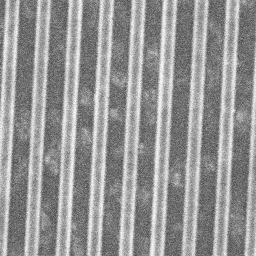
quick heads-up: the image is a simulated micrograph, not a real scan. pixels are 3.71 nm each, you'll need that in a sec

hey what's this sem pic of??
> parallel lines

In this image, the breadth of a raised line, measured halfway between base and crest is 11.5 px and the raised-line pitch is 0.117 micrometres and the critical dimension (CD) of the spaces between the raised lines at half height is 74.2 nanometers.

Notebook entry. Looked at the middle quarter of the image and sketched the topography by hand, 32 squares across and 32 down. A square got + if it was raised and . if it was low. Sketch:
.++......++.....+++.....+++.....
.++......++.....+++.....+++.....
.++.....+++.....+++.....+++.....
.++.....+++.....+++.....+++.....
+++.....+++.....+++.....+++.....
+++.....+++.....+++.....+++.....
+++.....+++.....+++.....+++.....
+++.....+++.....+++.....+++.....
+++.....+++.....+++.....+++.....
+++.....+++.....+++.....++......
+++.....+++.....+++.....++......
+++.....+++.....+++.....++......
+++.....+++.....+++.....++......
+++.....+++.....+++.....++.....+
+++.....++......+++.....++.....+
+++.....++......++......++.....+
+++.....++......++.....+++.....+
++......++......++.....+++.....+
++......++......++.....+++.....+
++......++......++.....+++.....+
++......++......++.....+++.....+
++.....+++......++.....+++.....+
++.....+++......++.....+++.....+
++.....+++.....+++.....+++.....+
++.....+++.....+++.....+++.....+
++.....+++.....+++.....+++.....+
++.....+++.....+++.....+++.....+
++.....+++.....+++.....+++.....+
++.....+++.....+++.....++......+
++.....+++.....+++.....++......+
++.....+++.....+++.....++......+
++.....+++.....+++.....++......+